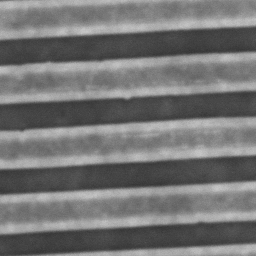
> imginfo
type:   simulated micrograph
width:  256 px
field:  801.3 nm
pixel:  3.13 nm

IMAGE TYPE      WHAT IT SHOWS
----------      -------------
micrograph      one or a few lines or trenches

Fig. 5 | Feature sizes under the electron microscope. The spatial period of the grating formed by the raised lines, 202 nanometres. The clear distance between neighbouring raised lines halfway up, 101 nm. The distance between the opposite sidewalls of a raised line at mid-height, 101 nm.